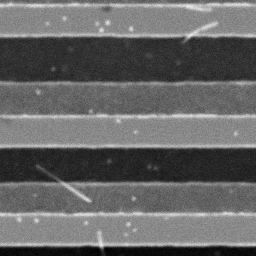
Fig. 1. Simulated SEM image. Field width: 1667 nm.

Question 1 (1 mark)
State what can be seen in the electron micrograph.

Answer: lines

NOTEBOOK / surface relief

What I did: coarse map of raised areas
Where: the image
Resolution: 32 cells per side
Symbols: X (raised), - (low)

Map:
XXXXXXXXXXXXXXXXXXXXXXXXXXXXXXXX
XXXXXXXXXXXXXXXXXXXXXXXXXXXXXXXX
XXXXXXXXXXXXXXXXXXXXXXXXXXXXXXXX
XXXXXXXXXXXXXXXXXXXXXXXXXXXXXXXX
XXX-X---------XXXXXXXXXX--XX--XX
--------------------------------
--------------------------------
--------------------------------
--------------------------------
--------------------------------
XXXXXXXXXXXXXXXXXXXXXXXXXXXXXXXX
XXXXXXXXXXXXXXXXXXXXXXXXXXXXXXXX
XXXXXXXXXXXXXXXXXXXXXXXXXXXXXXXX
XXXXXXXXXXXXXXXXXXXXXXXXXXXXXXXX
XXXXXXXXXXXXXXXXXXXXXXXXXXXXXXXX
XXXXXXXXXXXXXXXXXXXXXXXXXXXXXXXX
XXXXXXXXXXXXXXXXXXXXXXXXXXXXXXXX
XXXXXXXXXXXXXXXXXXXXXXXXXXXXXXXX
--------------------------------
--------------------------------
--------------------------------
--------------------------------
--------------------------------
XXXXXXXXXXXXXXXXXXXXXXXXXXXXXXXX
XXXXXXXXXXXXXXXXXXXXXXXXXXXXXXXX
XXXXXXXXXXXXXXXXXXXXXXXXXXXXXXXX
XXXXXXXXXXXXXXXXXXXXXXXXXXXXXXXX
XXXXXXXXXXXXXXXXXXXXXXXXXXXXXXXX
XXXXXXXXXXXXXXXXXXXXXXXXXXXXXXXX
XXXXXXXXXXXXXXXXXXXXXXXXXXXXXXXX
XXXXXXXXXXXXXXXXXXXXXXXXXXXXXXXX
--------------------------------